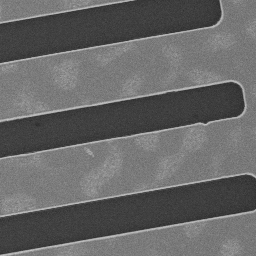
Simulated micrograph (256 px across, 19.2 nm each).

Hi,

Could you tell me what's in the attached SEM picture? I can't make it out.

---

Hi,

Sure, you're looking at one or a few lines or trenches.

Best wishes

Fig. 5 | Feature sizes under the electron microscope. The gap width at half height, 0.74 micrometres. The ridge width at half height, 1090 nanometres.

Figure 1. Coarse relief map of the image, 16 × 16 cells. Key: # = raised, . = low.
#####.........##
.............###
.........#######
...#############
################
############...#
######.........#
..............##
........########
..##############
################
############....
######..........
..............##
........########
...#############